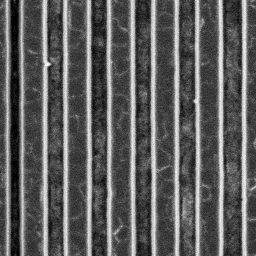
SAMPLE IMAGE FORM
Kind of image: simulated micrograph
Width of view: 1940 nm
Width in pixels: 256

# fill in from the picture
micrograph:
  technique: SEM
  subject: parallel lines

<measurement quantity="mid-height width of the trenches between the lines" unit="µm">0.144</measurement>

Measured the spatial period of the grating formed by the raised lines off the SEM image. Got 44 pixels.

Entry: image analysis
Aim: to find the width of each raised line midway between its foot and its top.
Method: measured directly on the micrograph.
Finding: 185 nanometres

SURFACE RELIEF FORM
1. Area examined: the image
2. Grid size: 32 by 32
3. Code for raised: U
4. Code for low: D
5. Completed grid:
UDDUUUDDUUUDDDUUUDDUUUDDDUUUDDUU
UDDUUUDDUUUDDDUUUDDUUUDDDUUUDDUU
UDDUUUDDUUUDDDUUUDDUUUDDDUUUDDDU
UDDUUUDDUUUDDDUUUDDUUUDDDUUUDDDU
UDDUUUDDUUUDDDUUUDDUUUDDDUUUDDDU
UDDUUUDDUUUDDDUUUDDUUUDDDUUUDDDU
UDDUUUDDUUUDDDUUUDDUUUDDDUUUDDDU
UDDUUUDDUUUDDDUUUDDUUUDDDUUUDDDU
UDDUUUDDUUUDDDUUUDDUUUDDDUUUDDDU
UDDUUUDDUUUDDDUUUDDUUUDDDUUUDDDU
UDDUUUDDUUUDDDUUUDDUUUDDDUUUDDDU
UDDUUUDDUUUDDDUUUDDUUUDDDUUUDDDU
UDDUUUDDUUUDDDUUUDDUUUDDDUUUDDDU
UDDUUUDDUUUDDDUUUDDUUUDDDUUUDDDU
UDDUUUDDUUUDDDUUUDDUUUDDDUUUDDDU
UDDUUUDDUUUDDDUUUDDUUUDDDUUUDDDU
UDDUUUDDUUUDDDUUUDDUUUDDDUUUDDDU
UDDUUUDDUUUDDDUUUDDUUUDDDUUUDDDU
UDDUUUDDUUUDDDUUUDDUUUDDDUUUDDDU
UDDUUUDDUUUDDDUUUDDUUUDDDUUUDDDU
UDDUUUDDUUUDDDUUUDDUUUDDDUUUDDDU
UDDUUUDDUUUDDDUUUDDUUUDDDUUUDDDU
UDDUUUDDUUUDDDUUUDDUUUDDDUUUDDDU
UDDUUUDDUUUDDDUUUDDUUUDDDUUUDDDU
UDDUUUDDUUUDDDUUUDDUUUDDDUUUDDDU
UDDUUUDDUUUDDDUUUDDUUUDDDUUUDDDU
UDDUUUDDUUUDDDUUUDDUUUDDDUUUDDUU
UDDUUUDDUUUDDDUUUDDUUUDDDUUUDDDU
UDDUUUDDUUUDDDUUUDDUUUDDDUUUDDDU
UDDUUUDDUUUDDDUUUDDUUUDDDUUUDDDU
UDDUUUDDUUUDDDUUUDDUUUDDDUUUDDDU
UDDUUUDDUUUDDDUUUDDUUUDDDUUUDDDU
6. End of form